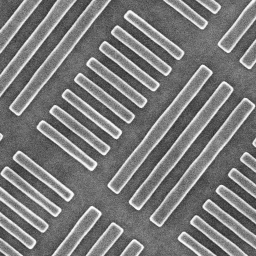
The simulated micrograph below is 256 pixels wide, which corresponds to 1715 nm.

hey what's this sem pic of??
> groups of lines, slits or small figures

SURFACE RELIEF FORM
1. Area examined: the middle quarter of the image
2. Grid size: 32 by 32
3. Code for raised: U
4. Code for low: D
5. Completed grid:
DDDDDDUUUUDDDDUUUUDDDDUUUUDDDDDD
DDDDDDDUUUUDDDDUUUUDDDDUUUUDDDDD
DDDDUDDDDUUUUDDDDUUUUDDDDUDDDDDD
DDDUUUDDDDUUUUDDDDUUUUDDDDDDDDDD
DDDUUUUDDDDUUUUDDDDUUUUDDDDDDDDU
DDDDUUUUUDDDUUUUDDDDDUUUDDDDDDUU
UDDDDDUUUUDDDDUUUUDDDDUDDDDDDDUU
UUUDDDDUUUUDDDDUUUUDDDDDDDDDDUUU
UUUUDDDDUUUUDDDDUUUUDDDDDDDDUUUU
DUUUUDDDDUUUUDDDDUUUDDDDDDDUUUUD
DDDUUUDDDDDUUUUDDDDUDDDDDDUUUUUD
DDDDUUUUDDDDUUUUDDDDDDDDDDUUUUDD
UDDDDUUUUDDDDUUUUDDDDDDDDUUUUDDD
UUDDDDUUUUDDDDUUUDDDDDDDUUUUDDDD
UUUDDDDDUUUUDDDDUDDDDDDUUUUUDDDD
DUUUUDDDDUUUDDDDDDDDDDUUUUUDDDDU
DDUUUUDDDDUUUUDDDDDDDDUUUUDDDDUU
DDDUUUUDDDDDUUDDDDDDDUUUUDDDDDUU
DDDDDUUUDDDDDDDDDDDDUUUUUDDDDUUU
UDDDDDUUUUDDDDDDDDDUUUUUDDDDUUUU
UUUDDDDUUUUDDDDDDDDUUUUDDDDUUUUU
UUUUDDDDUUUDDDDDDDUUUUDDDDUUUUUD
DUUUUDDDDUUDDDDDDUUUUDDDDDUUUUDD
DDDUUUDDDDDDDDDDUUUUDDDDDUUUUDDD
DDDDUUUUDDDDDDDUUUUUDDDDUUUUDDDD
DDDDDDUUDDDDDDUUUUUDDDDUUUUUDDDD
DDDDDDDDDDDDDDUUUUDDDDUUUUUDDDDU
DDDDDDDDDDDDDUUUUDDDDDUUUUDDDDUU
DDDDDDDDDDDDUUUUDDDDDUUUUDDDDUUU
DDDDDDDDDDDDUUUUDDDDUUUUDDDDDUUU
DDDDDDDDDDDUUUUDDDDUUUUDDDDDUUUU
UDDDDDDDDDDDUUDDDDUUUUUDDDDUUUUD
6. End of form